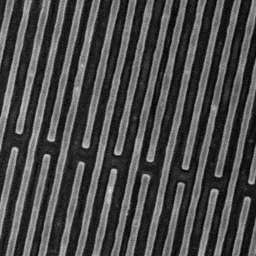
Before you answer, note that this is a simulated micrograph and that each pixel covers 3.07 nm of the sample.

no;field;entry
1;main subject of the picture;parallel lines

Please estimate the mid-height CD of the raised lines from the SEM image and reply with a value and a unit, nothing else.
20.6 nm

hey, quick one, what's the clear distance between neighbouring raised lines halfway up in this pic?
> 0.0327 µm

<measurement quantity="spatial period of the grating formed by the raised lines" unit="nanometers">52.3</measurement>